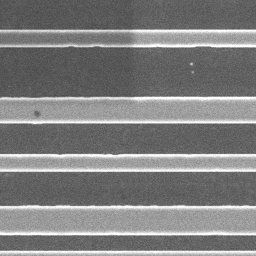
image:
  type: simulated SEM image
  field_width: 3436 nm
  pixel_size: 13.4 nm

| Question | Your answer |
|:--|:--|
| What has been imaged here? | lines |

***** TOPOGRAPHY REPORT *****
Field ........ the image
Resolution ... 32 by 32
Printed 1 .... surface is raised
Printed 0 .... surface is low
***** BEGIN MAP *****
00000000000000000000000000000000
00000000000000000000000000000000
00000000000000000000000000000000
00000000000000000000000000000000
11111111111111111111111111111111
11111111111111111111111111111111
00000000000000000000000000000000
00000000000000000000000000000000
00000000000000000000000000000000
00000000000000000000000000000000
00000000000000000000000000000000
00000000000000000000000000000000
11111111111111111111111111111111
11111111111111111111111111111111
11111111111111111111111111111111
00000000000000000000000000000000
00000000000000000000000000000000
00000000000000000000000000000000
00000000000000000000000000000000
11111111111111111111111111111111
11111111111111111111111111111111
00000000000000000000000000000000
00000000000000000000000000000000
00000000000000000000000000000000
00000000000000000000000000000000
00000000000000000000000000000000
11111111111111111111111111111111
11111111111111111111111111111111
11111111111111111111111111111111
00000000000000000000000000000000
00000000000000000000000000000000
11111111111111111111111111111111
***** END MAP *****